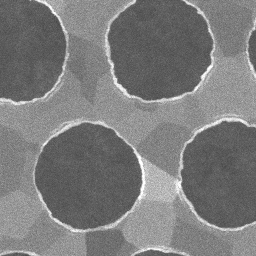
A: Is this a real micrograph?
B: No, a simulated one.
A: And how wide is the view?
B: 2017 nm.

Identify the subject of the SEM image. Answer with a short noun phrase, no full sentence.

holes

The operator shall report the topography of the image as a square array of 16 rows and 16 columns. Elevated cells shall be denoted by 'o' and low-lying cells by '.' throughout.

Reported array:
...ooooo....oooo
....ooo......ooo
....ooo......ooo
....ooo......ooo
....ooo......ooo
...ooooo....oooo
oooooooooooooooo
oooooooooooooo.o
ooo.....oooo....
ooo.....ooo.....
oo.......oo.....
oo.......oo.....
ooo......ooo....
ooo.....oooo....
oooooooooooooooo
oooooooooooooooo